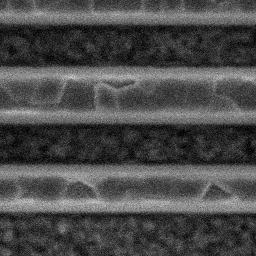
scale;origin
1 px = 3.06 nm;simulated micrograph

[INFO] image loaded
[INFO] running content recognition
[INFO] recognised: one or a few lines or trenches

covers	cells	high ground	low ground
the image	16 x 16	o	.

oooooooooooooooo
................
................
................
oooooooooooo.ooo
oooooooooooooooo
oooooooooooooooo
................
................
................
................
oooooooooooooooo
oooooooooooooooo
................
................
................